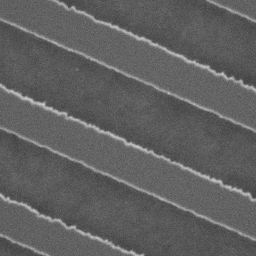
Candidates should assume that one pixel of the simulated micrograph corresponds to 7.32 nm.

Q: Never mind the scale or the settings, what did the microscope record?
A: lines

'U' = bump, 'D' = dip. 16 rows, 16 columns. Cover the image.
UUUUDDDDDDDDDDUU
DUUUUUUDDDDDDDDD
DDDUUUUUUDDDDDDD
DDDDDUUUUUUDDDDD
DDDDDDDUUUUUUUDD
DDDDDDDDDDUUUUUU
UUUDDDDDDDDDUUUU
UUUUUDDDDDDDDDUU
DUUUUUUDDDDDDDDD
DDDUUUUUUDDDDDDD
DDDDDDUUUUUUDDDD
DDDDDDDDUUUUUUDD
UDDDDDDDDDUUUUUU
UUUDDDDDDDDDUUUU
UUUUUDDDDDDDDDDU
DDUUUUUUDDDDDDDD